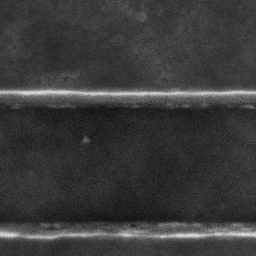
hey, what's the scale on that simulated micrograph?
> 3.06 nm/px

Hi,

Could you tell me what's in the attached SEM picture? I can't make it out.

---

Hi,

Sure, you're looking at one or a few lines or trenches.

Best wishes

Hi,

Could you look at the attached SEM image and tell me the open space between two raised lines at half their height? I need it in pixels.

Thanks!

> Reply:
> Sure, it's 142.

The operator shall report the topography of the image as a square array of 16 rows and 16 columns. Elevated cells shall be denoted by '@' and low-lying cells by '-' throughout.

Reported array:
@@@@@@@@@@@@@@@@
@@@@@@@@@@@@@@@@
@@@@@@@@@@@@@@@@
@@@@@@@@@@@@@@@@
@@@@@@@@@@@@@@@@
@@@@@@@@@@@@@@@@
----------------
----------------
----------------
----------------
----------------
----------------
----------------
----------------
----------------
@@@@@@@@@@@@@@@@